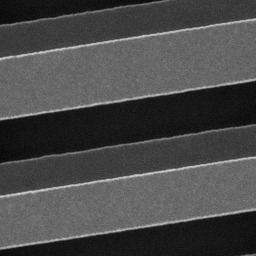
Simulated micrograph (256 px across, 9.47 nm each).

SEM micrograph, lines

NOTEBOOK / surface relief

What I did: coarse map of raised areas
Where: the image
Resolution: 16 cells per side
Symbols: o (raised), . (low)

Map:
.......ooooooooo
.ooooooooooooooo
oooooooooooooooo
oooooooooooooooo
oooooooooooooooo
ooooooooooooo...
ooooooo.........
................
...........ooooo
.....ooooooooooo
oooooooooooooooo
oooooooooooooooo
oooooooooooooooo
oooooooooooooo..
ooooooo.........
o...............